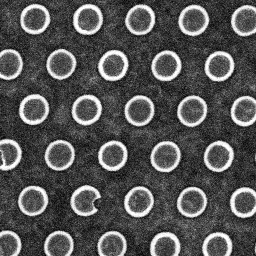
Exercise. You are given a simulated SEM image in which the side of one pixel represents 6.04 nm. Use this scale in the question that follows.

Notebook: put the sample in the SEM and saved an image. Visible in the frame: a regular array of raised bodies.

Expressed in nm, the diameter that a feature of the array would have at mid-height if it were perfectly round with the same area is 168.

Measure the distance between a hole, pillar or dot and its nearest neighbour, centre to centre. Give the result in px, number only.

52.1